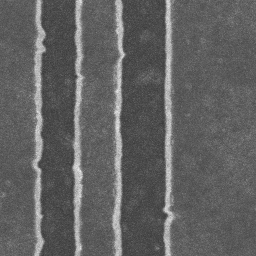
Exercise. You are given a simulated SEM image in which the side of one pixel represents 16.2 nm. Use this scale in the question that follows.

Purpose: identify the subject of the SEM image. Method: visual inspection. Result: one or a few lines or trenches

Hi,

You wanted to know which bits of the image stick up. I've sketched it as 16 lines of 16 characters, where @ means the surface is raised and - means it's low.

@@---@@----@@@@@
@@---@@@---@@@@@
@@@--@@@---@@@@@
@@---@@@---@@@@@
@@---@@----@@@@@
@@---@@----@@@@@
@@---@@----@@@@@
@@---@@----@@@@@
@@---@@---@@@@@@
@@---@@---@@@@@@
@@---@@----@@@@@
@@---@@----@@@@@
@@---@@---@@@@@@
@@---@@----@@@@@
@@---@@---@@@@@@
@@---@@---@@@@@@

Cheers